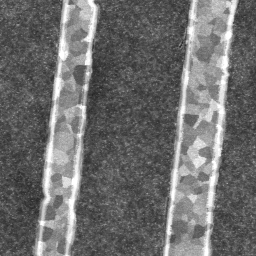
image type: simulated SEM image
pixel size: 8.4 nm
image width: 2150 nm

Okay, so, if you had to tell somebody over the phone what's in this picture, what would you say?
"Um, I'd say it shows one or a few lines or trenches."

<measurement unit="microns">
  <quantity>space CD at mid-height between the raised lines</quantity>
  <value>0.834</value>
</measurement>